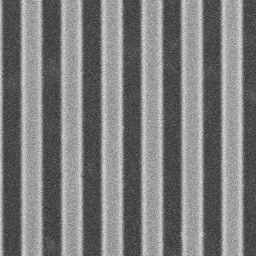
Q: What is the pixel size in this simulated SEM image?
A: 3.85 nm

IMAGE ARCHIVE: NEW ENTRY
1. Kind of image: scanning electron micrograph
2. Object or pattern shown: parallel lines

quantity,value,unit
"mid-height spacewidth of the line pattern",83.8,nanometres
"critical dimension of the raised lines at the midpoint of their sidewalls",71.3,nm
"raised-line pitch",154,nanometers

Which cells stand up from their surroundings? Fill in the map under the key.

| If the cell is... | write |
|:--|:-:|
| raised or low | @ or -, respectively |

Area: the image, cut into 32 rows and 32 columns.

---@@---@@---@@---@@---@@---@@--
---@@---@@---@@---@@---@@---@@--
---@@---@@---@@---@@---@@---@@--
---@@---@@---@@---@@---@@---@@--
---@@---@@---@@---@@---@@---@@--
---@@---@@---@@---@@---@@---@@--
---@@---@@---@@---@@---@@---@@--
---@@---@@---@@---@@---@@---@@--
---@@---@@---@@---@@---@@---@@--
---@@---@@---@@---@@---@@---@@--
---@@---@@---@@---@@---@@---@@--
---@@---@@---@@---@@---@@---@@--
---@@---@@---@@---@@---@@---@@--
---@@---@@---@@---@@---@@---@@--
---@@---@@---@@---@@---@@---@@--
---@@---@@---@@---@@---@@---@@--
---@@---@@---@@---@@---@@---@@--
---@@---@@---@@---@@---@@---@@--
---@@---@@---@@---@@---@@---@@--
---@@---@@---@@---@@---@@---@@--
---@@---@@---@@---@@---@@---@@--
---@@---@@---@@---@@---@@---@@--
---@@---@@---@@---@@---@@---@@--
---@@---@@---@@---@@---@@---@@--
---@@---@@---@@---@@---@@---@@--
---@@---@@---@@---@@---@@---@@--
---@@---@@---@@---@@---@@---@@--
---@@---@@---@@---@@---@@---@@--
---@@---@@---@@---@@---@@---@@--
---@@---@@---@@---@@---@@---@@--
---@@---@@---@@---@@---@@---@@--
---@@---@@---@@---@@---@@---@@--